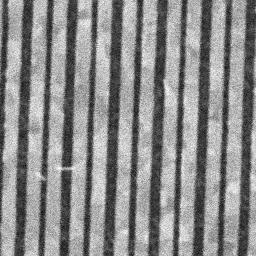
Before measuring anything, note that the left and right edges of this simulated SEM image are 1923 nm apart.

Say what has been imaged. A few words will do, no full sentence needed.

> parallel lines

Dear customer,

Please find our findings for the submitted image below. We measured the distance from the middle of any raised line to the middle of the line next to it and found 168 nanometers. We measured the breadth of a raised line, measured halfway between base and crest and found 99.5 nanometres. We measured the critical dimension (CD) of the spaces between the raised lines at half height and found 78.8 nanometres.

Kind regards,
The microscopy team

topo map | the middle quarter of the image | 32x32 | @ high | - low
---@@@--@@@---@@@--@@@@---@@@--@
---@@@--@@@---@@@--@@@----@@@--@
---@@@--@@@---@@@--@@@---@@@@--@
---@@@--@@@---@@@--@@@---@@@@-@@
---@@@--@@@---@@@--@@@---@@@--@@
---@@@--@@@---@@@--@@@---@@@--@@
---@@@--@@@---@@@--@@@---@@@--@@
---@@@--@@@---@@@--@@@---@@@--@@
---@@@--@@@---@@@--@@@---@@@--@@
---@@@--@@@---@@@--@@@---@@@--@@
---@@@--@@@---@@@--@@@---@@@--@@
---@@@--@@@---@@@--@@@---@@@--@@
---@@@--@@@---@@@--@@@---@@@--@@
---@@@--@@@---@@@--@@@---@@@--@@
---@@@--@@@---@@@--@@@---@@@--@@
--@@@@--@@@---@@@--@@@---@@@--@@
--@@@@--@@@---@@@--@@@---@@@--@@
--@@@@-@@@@---@@@--@@@---@@@--@@
--@@@@-@@@@---@@@--@@@---@@@--@@
--@@@@-@@@@---@@@--@@@---@@@--@@
--@@@@--@@----@@@--@@@---@@@--@@
--@@@@--@@----@@@--@@@---@@@--@@
--@@@@-@@@----@@@--@@@---@@@--@@
--@@@--@@@----@@@--@@@---@@@--@@
--@@@--@@@----@@@--@@@---@@@--@@
--@@@--@@@---@@@@--@@@---@@@--@@
--@@@--@@@---@@@@--@@@---@@@--@@
--@@@--@@@---@@@@-@@@@---@@@--@@
--@@@--@@@---@@@--@@@@---@@@--@@
--@@@--@@@---@@@--@@@----@@@--@@
--@@@--@@@---@@@--@@@---@@@@--@@
--@@@--@@@---@@@--@@@---@@@@-@@@